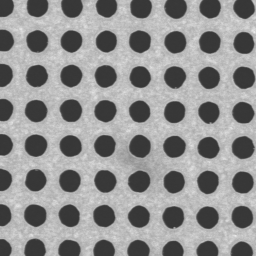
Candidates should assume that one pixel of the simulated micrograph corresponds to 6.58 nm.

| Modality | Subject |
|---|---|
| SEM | a regular array of holes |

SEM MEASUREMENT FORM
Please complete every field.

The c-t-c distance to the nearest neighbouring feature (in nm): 226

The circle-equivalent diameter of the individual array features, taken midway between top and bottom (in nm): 145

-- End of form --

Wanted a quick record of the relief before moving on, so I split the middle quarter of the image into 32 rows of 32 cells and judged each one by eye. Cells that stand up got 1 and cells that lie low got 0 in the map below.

10011111100111111100111111111111
00001111000001111000011111000011
00001111000001111000001110000011
00001111000001110000001110000001
00001111000001111000011110000011
00011111100011111000011111000111
11111111111111111111111111111111
11111111111111111111111111111111
11111111111111111111111111111111
00001111100011111100111111000111
00001111000001111000011110000011
00000111000001110000001110000011
00001111000001110000001110000011
00001111000011111000011110000011
10111111110111111100111111000111
11111111111111111111111111111111
11111111111111111111111111111111
11111111111111111111111111111111
00011111000011111000011111000111
00001111000001110000011110000011
00000110000001110000001110000001
00001111000001110000001110000011
00001111000011111000011111000011
11111111111111111110111111111111
11111111111111111111111111111111
11111111111111111111111111111111
10111111100111111111111111111111
00001111000011111000011111000111
00001111000001110000011110000011
00001110000001110000001110000011
00001111000001110000011110000011
00011111100011111000111111000111